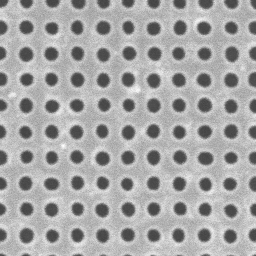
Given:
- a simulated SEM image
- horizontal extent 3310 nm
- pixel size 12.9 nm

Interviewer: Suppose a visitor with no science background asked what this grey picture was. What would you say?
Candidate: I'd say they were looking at a regular array of holes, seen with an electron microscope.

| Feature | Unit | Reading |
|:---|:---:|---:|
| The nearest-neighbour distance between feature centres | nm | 324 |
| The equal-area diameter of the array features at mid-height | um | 0.189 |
